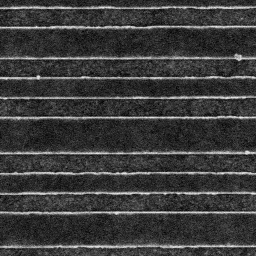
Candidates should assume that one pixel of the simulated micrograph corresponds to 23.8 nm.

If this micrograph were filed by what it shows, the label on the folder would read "lines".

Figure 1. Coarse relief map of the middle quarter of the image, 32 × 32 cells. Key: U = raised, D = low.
DDDDDDDDDDDDDDDDDDDDDDDDDDDDDDDD
DDDDDDDDDDDDDDDDDDDDDDDDDDDDDDDD
DDDDDDDDDDDDDDDDDDDDDDDDDDDDDDDD
DDDDUUDDDDDDDUDDDDDDDDDDDDDDDDDD
UUUUUUUUUUUUUUUUUUUUUUUUUUUUUUUU
UUUUUUUUUUUUUUUUUUUUUUUUUUUUUUUU
UUUUUUUUUUUUUUUUUUUUUUUUUUUUUUUU
UUUUUUUUUUUUUUUUUUUUUUUUUUUUUUUU
DDDDDDDDDDDDDDDDDDDDDDDDDDDDDDDD
DDDDDDDDDDDDDDDDDDDDDDDDDDDDDDDD
DDDDDDDDDDDDDDDDDDDDDDDDDDDDDDDD
DDDDDDDDDDDDDDDDDDDDDDDDDDDDDDDD
DDDDDDDDDDDDDDDDDDDDDDDDDDDDDDDD
UUUUUUUUUUUUUUUUUUUUUUUUUUUUUUUU
UUUUUUUUUUUUUUUUUUUUUUUUUUUUUUUU
UUUUUUUUUUUUUUUUUUUUUUUUUUUUUUUU
UUUUUUUUUUUUUUUUUUUUUUUUUUUUUUUU
UUUUUUUUUUUUUUUUUUUUUUUUUUUUUUUU
UUUUUUUUUUUUUUUUUUUUUUUUUUUUUUUU
UUUUUUUUUUUUUUUUUUUUUUUUUUUUUUUU
UUUUUUUUUUUUUUUUUUUUUUUUUUUUUUUU
UUUUUUUUUUUUUUUUUUUUUUUUUUUUUUUU
DDDDDDDDDDDDDDDDDDDDDDDDDDDDDDDD
DDDDDDDDDDDDDDDDDDDDDDDDDDDDDDDD
DDDDDDDDDDDDDDDDDDDDDDDDDDDDDDDD
DDDDDDDDDDDDDDDDDDDDDDDDDDDDDDDD
DDDDDDDDDDDDDDDDDDDDDDDDDDDDDDDD
UUDDUUUUUUUUDUUUDUUUUUUUUUUUUUUU
UUUUUUUUUUUUUUUUUUUUUUUUUUUUUUUU
UUUUUUUUUUUUUUUUUUUUUUUUUUUUUUUU
UUUUUUUUUUUUUUUUUUUUUUUUUUUUUUUU
UUUUUUUUUUUUUUUUUUUUUUUUUUUUUUUU